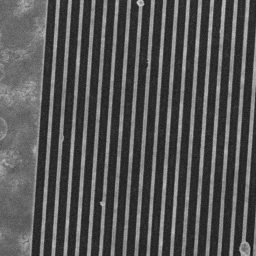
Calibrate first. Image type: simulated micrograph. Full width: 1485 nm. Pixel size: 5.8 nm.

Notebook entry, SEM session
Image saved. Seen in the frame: parallel lines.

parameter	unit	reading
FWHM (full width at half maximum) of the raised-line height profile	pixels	3.36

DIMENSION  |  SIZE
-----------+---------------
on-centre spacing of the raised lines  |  68.6 nm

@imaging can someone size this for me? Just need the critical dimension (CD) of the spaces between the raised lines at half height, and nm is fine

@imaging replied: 49.2